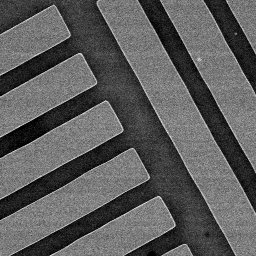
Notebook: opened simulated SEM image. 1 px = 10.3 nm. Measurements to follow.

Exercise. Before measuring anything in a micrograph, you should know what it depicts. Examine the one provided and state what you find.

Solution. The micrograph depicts groups of lines, slits or small figures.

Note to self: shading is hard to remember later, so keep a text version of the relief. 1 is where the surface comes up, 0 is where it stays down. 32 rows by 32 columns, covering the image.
00000000000011111100111111001111
00000110000001111100011111000111
00011111000001111110011111100011
00111111000000111110001111100011
11111111100000111111000111110001
11111110000000011111000111110001
11111000000000011111100011111000
11110000111000001111100011111100
11000011111000001111110001111100
00000111111100000111111001111110
00011111111100000011111000111110
01111111110000000011111100111111
11111111100000000001111100011111
11111110000111000001111110011111
11111000001111100000111110001111
11100000111111100000111111000111
10000011111111100000011111000111
00001111111111000000011111100011
00111111111100000000001111100011
01111111110000011000000111110001
11111111000001111100000111111001
11111100000111111100000011111000
11110000011111111100000011111100
11100000111111111000000001111100
10000011111111100000000001111110
00001111111110000011100000111110
00111111111000001111100000111111
11111111110000111111110000011111
11111111000011111111110000001111
11111100000111111111000000001111
11110000011111111100000000000111
11000001111111110000011100000111